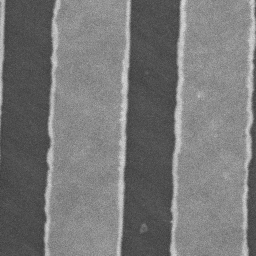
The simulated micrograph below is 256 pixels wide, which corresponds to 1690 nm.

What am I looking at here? one or a few lines or trenches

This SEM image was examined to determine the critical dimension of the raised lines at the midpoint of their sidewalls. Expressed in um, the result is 0.481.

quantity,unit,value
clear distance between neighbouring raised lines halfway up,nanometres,351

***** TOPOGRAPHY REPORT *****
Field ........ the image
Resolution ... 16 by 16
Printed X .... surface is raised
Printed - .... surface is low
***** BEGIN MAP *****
----XXXX---XXXXX
---XXXXX---XXXXX
---XXXXX---XXXXX
---XXXXX---XXXXX
---XXXXX---XXXXX
---XXXXX---XXXXX
---XXXXX---XXXXX
---XXXXX---XXXXX
---XXXXX---XXXXX
---XXXXX---XXXXX
---XXXXX---XXXX-
---XXXXX---XXXX-
---XXXXX---XXXX-
---XXXXX---XXXX-
---XXXXX---XXXX-
---XXXX----XXXX-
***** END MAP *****